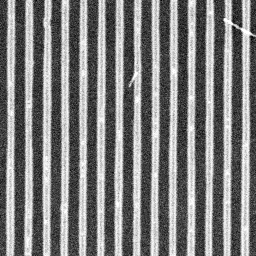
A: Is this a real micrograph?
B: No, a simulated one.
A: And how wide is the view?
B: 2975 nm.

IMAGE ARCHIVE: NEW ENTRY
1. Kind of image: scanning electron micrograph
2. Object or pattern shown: parallel lines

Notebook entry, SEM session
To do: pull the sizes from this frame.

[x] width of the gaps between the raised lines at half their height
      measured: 144 nm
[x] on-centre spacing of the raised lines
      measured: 0.21 microns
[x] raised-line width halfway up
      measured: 62.5 nanometers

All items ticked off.